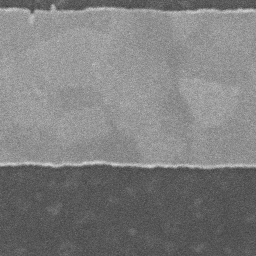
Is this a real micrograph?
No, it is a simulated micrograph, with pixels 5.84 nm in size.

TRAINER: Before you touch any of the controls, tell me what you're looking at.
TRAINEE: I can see one or a few lines or trenches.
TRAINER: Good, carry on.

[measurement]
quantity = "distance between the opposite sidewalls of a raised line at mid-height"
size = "905 nm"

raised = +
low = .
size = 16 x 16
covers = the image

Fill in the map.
................
++++++++++++++++
++++++++++++++++
++++++++++++++++
++++++++++++++++
++++++++++++++++
++++++++++++++++
++++++++++++++++
++++++++++++++++
++++++++++++++++
................
................
................
................
................
................